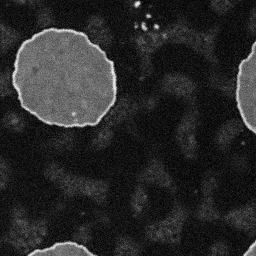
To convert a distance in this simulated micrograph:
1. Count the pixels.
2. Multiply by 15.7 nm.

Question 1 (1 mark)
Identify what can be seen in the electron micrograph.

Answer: raised bodies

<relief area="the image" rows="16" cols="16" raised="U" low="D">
DDDDDDDDDDDDDDDD
DDDDDDDDDDDDDDDD
DDUUUUDDDDDDDDDD
DUUUUUUDDDDDDDDD
DUUUUUUDDDDDDDDU
DUUUUUUDDDDDDDDU
DUUUUUUDDDDDDDDU
DDDUUUDDDDDDDDDU
DDDDDDDDDDDDDDDD
DDDDDDDDDDDDDDDD
DDDDDDDDDDDDDDDD
DDDDDDDDDDDDDDDD
DDDDDDDDDDDDDDDD
DDDDDDDDDDDDDDDD
DDDDDDDDDDDDDDDD
DDDUUDDDDDDDDDDD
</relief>